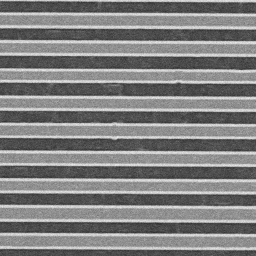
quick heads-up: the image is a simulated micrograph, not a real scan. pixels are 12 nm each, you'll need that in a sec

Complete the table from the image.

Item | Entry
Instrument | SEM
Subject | parallel lines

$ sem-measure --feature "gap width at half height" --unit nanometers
188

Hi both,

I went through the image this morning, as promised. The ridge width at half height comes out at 146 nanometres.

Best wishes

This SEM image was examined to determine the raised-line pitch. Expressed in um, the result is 0.331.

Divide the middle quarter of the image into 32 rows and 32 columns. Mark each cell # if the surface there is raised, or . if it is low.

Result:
................................
................................
################################
################################
................................
................................
................................
................................
############################....
################################
################################
..........................######
................................
................................
................................
################################
################################
################################
................................
................................
................................
................................
################################
################################
################################
................................
................................
................................
................................
################################
################################
################################